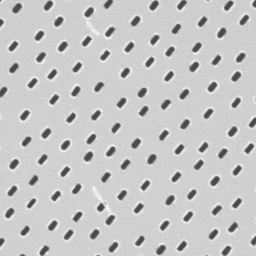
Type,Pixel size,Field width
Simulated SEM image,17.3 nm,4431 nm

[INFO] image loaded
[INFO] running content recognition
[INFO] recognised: a regular array of holes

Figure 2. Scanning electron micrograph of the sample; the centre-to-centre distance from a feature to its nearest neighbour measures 386 nm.